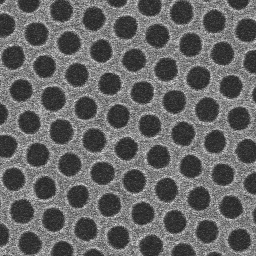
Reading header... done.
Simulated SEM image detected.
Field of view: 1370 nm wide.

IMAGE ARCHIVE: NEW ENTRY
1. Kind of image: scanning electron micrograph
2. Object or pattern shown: a regular array of holes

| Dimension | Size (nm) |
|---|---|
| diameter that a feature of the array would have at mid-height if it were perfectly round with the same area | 122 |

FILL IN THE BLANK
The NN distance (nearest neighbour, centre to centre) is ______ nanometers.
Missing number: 176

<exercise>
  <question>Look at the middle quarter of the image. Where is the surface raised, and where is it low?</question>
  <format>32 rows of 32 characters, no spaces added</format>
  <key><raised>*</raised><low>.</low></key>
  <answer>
**...**********.....***.....****
*.....**********...****.....***.
......****...**********.....***.
......***.....**********...****.
*....****.....****...**********.
**..*****.....***.....*********.
*********.....***.....**********
**********...****.....***.....**
****...**********.....***.....**
***.....**********...****.....**
***.....****...**********.....**
***.....***.....**********....**
***.....***.....****************
****...****.....***....*********
.**********.....***.....********
..**********...****.....****....
..****...**********.....***.....
..***.....**********...****.....
..***.....*****.***********.....
.****.....***.....*********.....
*****.....***.....*****..*******
******...****.....****....******
..***********.....***.....******
....**********...****.....****..
....*****.***********.....***...
....***.....**********...****...
....***......****.***********...
...****......**.....*********...
*******.....***.....*****.*****.
********...****.....***.....****
***..**********.....***.....****
*.....**********...****.....****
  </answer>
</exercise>